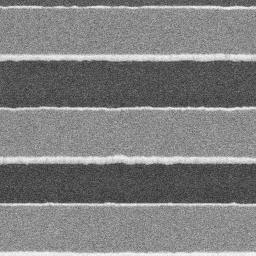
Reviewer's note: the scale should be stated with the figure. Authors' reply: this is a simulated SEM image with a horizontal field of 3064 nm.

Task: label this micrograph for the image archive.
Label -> lines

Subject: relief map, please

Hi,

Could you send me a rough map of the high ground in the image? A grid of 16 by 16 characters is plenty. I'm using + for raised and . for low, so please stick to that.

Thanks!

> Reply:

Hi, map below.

++++++++++++++++
++++++++++++++++
++++++++++++++++
++++++++++++++++
................
................
................
++++++++++++++++
++++++++++++++++
++++++++++++++++
................
................
................
++++++++++++++++
++++++++++++++++
++++++++++++++++